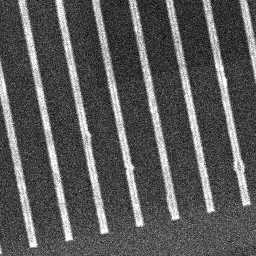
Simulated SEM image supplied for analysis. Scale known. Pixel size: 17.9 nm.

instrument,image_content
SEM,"parallel lines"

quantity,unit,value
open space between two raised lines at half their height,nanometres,536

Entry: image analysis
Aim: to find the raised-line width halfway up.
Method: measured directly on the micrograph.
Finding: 0.109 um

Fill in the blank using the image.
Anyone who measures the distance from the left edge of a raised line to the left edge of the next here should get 646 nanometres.